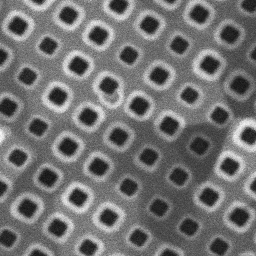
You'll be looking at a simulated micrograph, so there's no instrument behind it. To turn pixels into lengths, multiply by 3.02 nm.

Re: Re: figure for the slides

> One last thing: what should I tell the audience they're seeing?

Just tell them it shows a regular array of holes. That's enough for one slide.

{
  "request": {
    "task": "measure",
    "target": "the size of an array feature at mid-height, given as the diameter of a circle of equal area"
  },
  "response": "57.6 nm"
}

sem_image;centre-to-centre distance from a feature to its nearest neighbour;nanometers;109